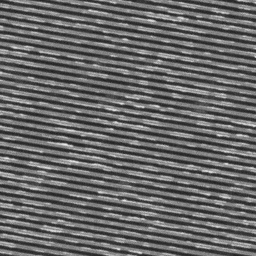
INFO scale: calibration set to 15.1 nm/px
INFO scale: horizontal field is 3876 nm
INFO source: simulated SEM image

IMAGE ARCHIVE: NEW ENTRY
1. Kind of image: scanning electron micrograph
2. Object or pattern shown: parallel lines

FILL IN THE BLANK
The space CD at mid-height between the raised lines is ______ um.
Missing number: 0.0635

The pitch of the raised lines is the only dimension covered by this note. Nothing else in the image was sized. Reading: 115 nm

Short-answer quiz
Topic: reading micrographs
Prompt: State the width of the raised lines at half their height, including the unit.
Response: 0.056 um